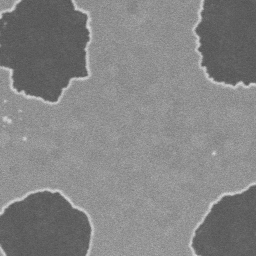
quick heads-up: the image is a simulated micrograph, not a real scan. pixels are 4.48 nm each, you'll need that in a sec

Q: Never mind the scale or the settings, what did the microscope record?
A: holes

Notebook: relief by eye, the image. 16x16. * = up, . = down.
*....********...
......******....
......******....
.....*******....
*....********...
*...************
****************
****************
****************
****************
****************
****************
*...**********..
.....********...
......******....
......******....